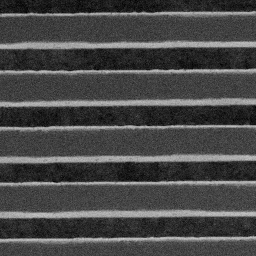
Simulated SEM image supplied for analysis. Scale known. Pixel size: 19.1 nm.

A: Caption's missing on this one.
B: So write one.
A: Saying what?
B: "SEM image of lines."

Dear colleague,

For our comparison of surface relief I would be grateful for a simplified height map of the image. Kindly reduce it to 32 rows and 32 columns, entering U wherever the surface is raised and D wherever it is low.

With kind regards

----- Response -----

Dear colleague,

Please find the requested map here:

DDDDDDDDDDDDDDDDDDDDDDDDDDDDDDDD
DDDDDDDDDDDDDDDDDDDDDDDDDDDDDDDD
UUUUUUUUUUUUUUUUUUUUUUUUUUUUUUUU
UUUUUUUUUUUUUUUUUUUUUUUUUUUUUUUU
UUUUUUUUUUUUUUUUUUUUUUUUUUUUUUUU
UUUUUUUUUUUUUUUUUUUUUUUUUUUUUUUU
DDDDDDDDDDDDDDDDDDDDDDDDDDDDDDDD
DDDDDDDDDDDDDDDDDDDDDDDDDDDDDDDD
DDDDDDDDDDDDDDDDDDDDDDDDDDDDDDDD
UUUUUUUUUUUUUUUUUUUUUUUUUUUUUUUU
UUUUUUUUUUUUUUUUUUUUUUUUUUUUUUUU
UUUUUUUUUUUUUUUUUUUUUUUUUUUUUUUU
UUUUUUUUUUUUUUUUUUUUUUUUUUUUUUUU
DDDDDDDDDDDDDDDDDDDDDDDDDDDDDDDD
DDDDDDDDDDDDDDDDDDDDDDDDDDDDDDDD
DDDDDDDDDDDDDDDDDDDDDDDDDDDDDDDD
UUUUUUUUUUUUUUUUUUUUUUUUUUUUUUUU
UUUUUUUUUUUUUUUUUUUUUUUUUUUUUUUU
UUUUUUUUUUUUUUUUUUUUUUUUUUUUUUUU
UUUUUUUUUUUUUUUUUUUUUUUUUUUUUUUU
DDDDDDDDDDDDDDDDDDDDDDDDDDDDDDDD
DDDDDDDDDDDDDDDDDDDDDDDDDDDDDDDD
DDDDDDDDDDDDDDDDDDDDDDDDDDDDDDDD
UUUUUUUUUUUUUUUUUUUUUUUUUUUUUUUU
UUUUUUUUUUUUUUUUUUUUUUUUUUUUUUUU
UUUUUUUUUUUUUUUUUUUUUUUUUUUUUUUU
UUUUUUUUUUUUUUUUUUUUUUUUUUUUUUUU
DDDDDDDDDDDDDDDDDDDDDDDDDDDDDDDD
DDDDDDDDDDDDDDDDDDDDDDDDDDDDDDDD
DDDDDDDDDDDDDDDDDDDDDDDDDDDDDDDD
UUUUUUUUUUUUUUUUUUUUUUUUUUUUUUUU
UUUUUUUUUUUUUUUUUUUUUUUUUUUUUUUU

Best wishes